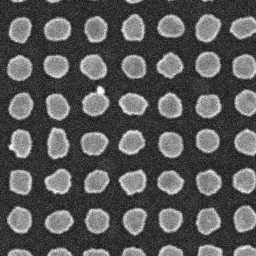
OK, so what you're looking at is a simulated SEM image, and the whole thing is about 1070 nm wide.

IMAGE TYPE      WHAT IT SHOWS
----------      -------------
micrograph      a regular array of raised bodies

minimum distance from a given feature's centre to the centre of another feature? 153 nm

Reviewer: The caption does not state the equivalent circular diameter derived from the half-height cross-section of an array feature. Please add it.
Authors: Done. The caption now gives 0.0992 um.